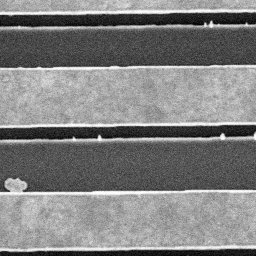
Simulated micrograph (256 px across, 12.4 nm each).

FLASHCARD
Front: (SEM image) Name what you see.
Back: lines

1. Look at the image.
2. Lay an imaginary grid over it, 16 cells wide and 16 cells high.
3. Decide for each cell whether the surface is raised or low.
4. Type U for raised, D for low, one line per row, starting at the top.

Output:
UUUUUUUUUUUUUUUU
DDDDDDDDDDDDDDDD
DDDDDDDDDDDDDDDD
DDDDDDDDDDDDDDDD
UUUUUUUUUUUUUUUU
UUUUUUUUUUUUUUUU
UUUUUUUUUUUUUUUU
UUUUUUUUUUUUUUUU
DDDDDDDDDDDDDDDD
DDDDDDDDDDDDDDDD
DDDDDDDDDDDDDDDD
DDDDDDDDDDDDDDDD
UUUUUUUUUUUUUUUU
UUUUUUUUUUUUUUUU
UUUUUUUUUUUUUUUU
UUUUUUUUUUUUUUDD